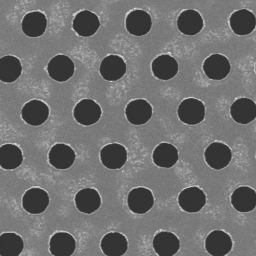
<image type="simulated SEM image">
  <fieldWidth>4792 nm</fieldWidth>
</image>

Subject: a regular array of holes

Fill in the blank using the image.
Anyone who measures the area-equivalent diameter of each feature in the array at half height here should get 0.496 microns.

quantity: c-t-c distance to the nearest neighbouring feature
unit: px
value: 51.1